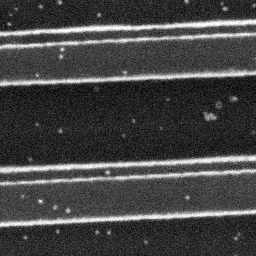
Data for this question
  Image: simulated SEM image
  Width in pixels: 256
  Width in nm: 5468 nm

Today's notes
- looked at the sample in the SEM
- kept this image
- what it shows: lines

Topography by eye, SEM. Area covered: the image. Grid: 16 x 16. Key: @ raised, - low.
----------------
----------------
@@@@@@@@@@@@@@@@
@@@@@@@@@@@@@@@@
@@@@@@@@@@@@@@@@
----------------
----------------
----------------
----------------
----------------
-----@@@@@@@@@@@
@@@@@@@@@@@@@@@@
@@@@@@@@@@@@@@@@
@@@@@@@@@@@@----
----------------
----------------